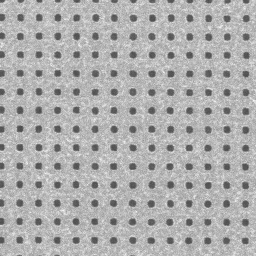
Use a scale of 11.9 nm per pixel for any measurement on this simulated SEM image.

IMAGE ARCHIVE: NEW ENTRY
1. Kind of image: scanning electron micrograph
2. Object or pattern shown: a regular array of holes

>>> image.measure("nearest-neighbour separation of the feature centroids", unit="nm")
218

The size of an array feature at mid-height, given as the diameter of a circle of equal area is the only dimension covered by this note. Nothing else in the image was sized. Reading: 0.0954 µm